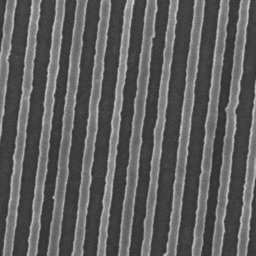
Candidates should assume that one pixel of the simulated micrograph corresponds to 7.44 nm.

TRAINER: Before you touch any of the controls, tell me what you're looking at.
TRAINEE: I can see parallel lines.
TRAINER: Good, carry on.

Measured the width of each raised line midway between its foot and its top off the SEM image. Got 70.2 nm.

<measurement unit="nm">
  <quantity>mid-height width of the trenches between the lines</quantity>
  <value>109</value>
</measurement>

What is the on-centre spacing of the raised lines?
172 nm